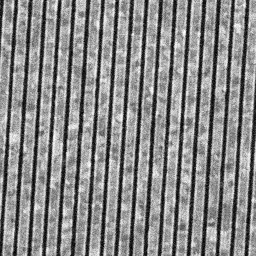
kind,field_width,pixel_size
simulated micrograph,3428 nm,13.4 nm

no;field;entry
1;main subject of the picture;parallel lines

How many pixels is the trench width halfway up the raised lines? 5.49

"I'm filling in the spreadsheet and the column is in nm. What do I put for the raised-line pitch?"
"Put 193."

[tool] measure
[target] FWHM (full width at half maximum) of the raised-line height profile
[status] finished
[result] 0.122 micrometres